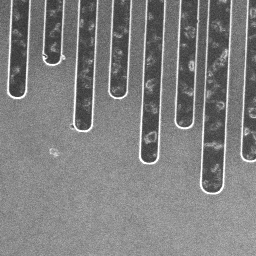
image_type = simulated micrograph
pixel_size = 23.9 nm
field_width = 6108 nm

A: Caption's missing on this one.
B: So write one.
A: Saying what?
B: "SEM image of parallel lines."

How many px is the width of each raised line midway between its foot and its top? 19.1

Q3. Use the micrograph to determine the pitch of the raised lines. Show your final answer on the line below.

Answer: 0.791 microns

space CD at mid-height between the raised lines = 348 nanometres